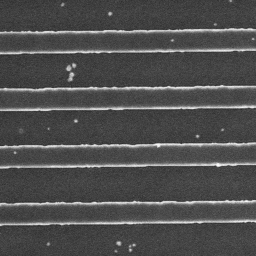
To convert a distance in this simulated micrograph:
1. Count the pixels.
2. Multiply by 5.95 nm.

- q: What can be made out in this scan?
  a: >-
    lines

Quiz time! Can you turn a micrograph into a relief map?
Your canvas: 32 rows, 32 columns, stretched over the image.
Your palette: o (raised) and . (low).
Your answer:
................................
................................
................................
................................
oooooooooooooooooooooooooooooooo
oooooooooooooooooooooooooooooooo
oooooooooooooo..................
................................
................................
................................
................................
oooooooooooooooooooooooooooooooo
oooooooooooooooooooooooooooooooo
ooooooooooooooooooooooooo.......
................................
................................
................................
................................
oooooooooooooooooooooooooooooooo
oooooooooooooooooooooooooooooooo
oooooooooooooooooooooooooooooooo
................................
................................
................................
................................
o.oooooooooooooooooooooooooooooo
oooooooooooooooooooooooooooooooo
oooooooooooooooooooooooooooooooo
................................
................................
................................
................................